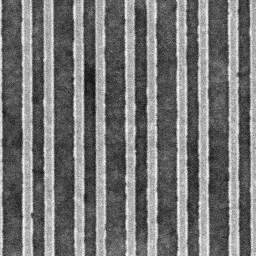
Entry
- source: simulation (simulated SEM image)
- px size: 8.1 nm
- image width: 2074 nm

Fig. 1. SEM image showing parallel lines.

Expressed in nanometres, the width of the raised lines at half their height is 70.9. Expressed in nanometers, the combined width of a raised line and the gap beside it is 209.